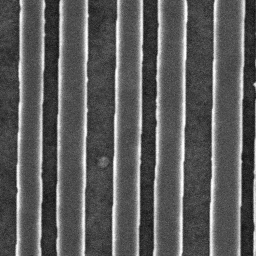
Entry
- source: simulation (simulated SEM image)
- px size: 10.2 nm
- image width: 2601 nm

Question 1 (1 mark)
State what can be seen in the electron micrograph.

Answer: lines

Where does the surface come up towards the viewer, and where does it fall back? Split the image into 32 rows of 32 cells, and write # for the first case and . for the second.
...###..###....###..###....####.
...##...###....###..###....####.
...##...###....###..###....###..
...##...###....###..###....###..
...##...###....###..###....###..
...##...###....###..###....###..
...##...###....###..###....###..
...##..####....###..###....###..
..###..####....###..###....###..
..###..####....###..###....###..
...##..####....###..###....###..
...##..####....###..###....###..
...##..####....###..###....###..
..###..####....###..###....###..
..###..####...####..###....###..
..###..####...####..###....###..
..###..####...####..###....###..
..###..####...####..###....###..
..###..####...####..###....###..
..###..####...####..###....###..
..###..####...###..####....###..
..###..####...###..####....###..
..###..####...###..####...####..
..###..####...###..####...####..
..###..####...###..####...####..
..###..####...###..####...####..
..###..####...###..####...####..
..###..####...###..####...####..
..###..####...###..####...####..
..###..####...###..####...####..
..###..####...###..####...####..
..###..####...###..####...####..